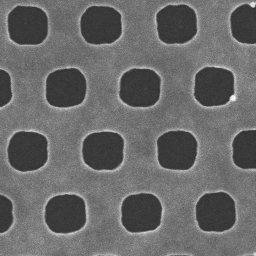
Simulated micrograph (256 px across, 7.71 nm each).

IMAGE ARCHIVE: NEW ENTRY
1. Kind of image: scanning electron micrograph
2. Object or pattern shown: a regular array of holes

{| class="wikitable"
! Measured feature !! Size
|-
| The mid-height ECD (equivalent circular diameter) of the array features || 321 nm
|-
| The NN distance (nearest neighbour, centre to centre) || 560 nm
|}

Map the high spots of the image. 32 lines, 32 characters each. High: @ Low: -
@@@@@@@@@@@@@@@@@@@@@@@@@@@@@@@@
@-----@@@@@----@@@@@----@@@@@---
@-----@@@@-----@@@@@-----@@@@---
@-----@@@@-----@@@@@-----@@@@---
@-----@@@@-----@@@@@----@@@@@---
@@---@@@@@@---@@@@@@@@@@@@@@@@@@
@@@@@@@@@@@@@@@@@@@@@@@@@@@@@@@@
@@@@@@@@@@@@@@@@@@@@@@@@@@@@@@@@
@@@@@@@@@@@@@@@@@@@@@@@@@@-@@@@@
-@@@@@----@@@@@-----@@@@-----@@@
-@@@@@-----@@@@-----@@@@-----@@@
--@@@@-----@@@@-----@@@@-----@@@
-@@@@@----@@@@@-----@@@@@----@@@
@@@@@@@@@@@@@@@@@@@@@@@@@@@@@@@@
@@@@@@@@@@@@@@@@@@@@@@@@@@@@@@@@
@@@@@@@@@@@@@@@@@@@@@@@@@@@@@@@@
@@--@@@@@@@@--@@@@@@@---@@@@@@--
@-----@@@@@----@@@@@----@@@@@---
@-----@@@@------@@@@-----@@@@---
@-----@@@@-----@@@@@----@@@@@---
@-----@@@@@----@@@@@----@@@@@---
@@@@@@@@@@@@@@@@@@@@@@@@@@@@@@@@
@@@@@@@@@@@@@@@@@@@@@@@@@@@@@@@@
@@@@@@@@@@@@@@@@@@@@@@@@@@@@@@@@
@@@@@@@---@@@@@@---@@@@@@----@@@
--@@@@-----@@@@-----@@@@@----@@@
--@@@@-----@@@@-----@@@@-----@@@
--@@@@-----@@@@-----@@@@@----@@@
-@@@@@----@@@@@@----@@@@@----@@@
@@@@@@@@@@@@@@@@@@@@@@@@@@@@@@@@
@@@@@@@@@@@@@@@@@@@@@@@@@@@@@@@@
@@@@@@@@@@@@@@@@@@@@@@@@@@@@@@@@